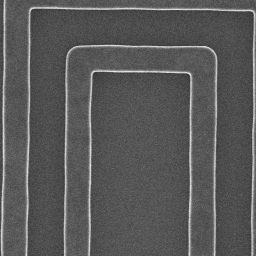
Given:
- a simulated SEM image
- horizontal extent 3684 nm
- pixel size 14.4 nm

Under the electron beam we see groups of lines, slits or small figures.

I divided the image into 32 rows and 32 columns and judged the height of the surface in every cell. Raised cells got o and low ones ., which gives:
.ooooooooooooooooooooooooooooooo
.ooo...........................o
.ooo............................
.ooo............................
.ooo............................
.ooo............................
.ooo.....oooooooooooooooooo.....
.ooo....ooooooooooooooooooo.....
.ooo....ooooooooooooooooooo.....
.ooo....oooo............ooo.....
oooo....ooo.............ooo.....
oooo....ooo.............ooo.....
oooo....ooo.............ooo.....
oooo....ooo.............ooo.....
oooo....ooo.............ooo.....
oooo....ooo.............ooo.....
oooo....ooo.............ooo.....
oooo....ooo.............ooo.....
oooo....ooo.............ooo.....
oooo....ooo.............ooo.....
oooo....ooo.............ooo.....
ooo.....ooo.............ooo.....
ooo.....ooo.............ooo.....
ooo.....ooo.............ooo.....
ooo.....ooo.............ooo.....
oooo....ooo.............ooo.....
ooo.....ooo.............ooo.....
ooo.....ooo.............ooo.....
ooo.....ooo.............ooo.....
ooo.....ooo.............ooo.....
ooo.....ooo.............ooo.....
ooo.....ooo.............ooo.....